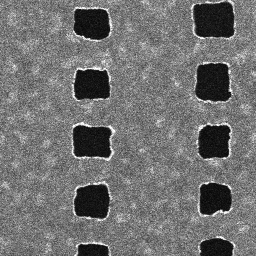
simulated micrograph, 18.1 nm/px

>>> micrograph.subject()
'a regular array of holes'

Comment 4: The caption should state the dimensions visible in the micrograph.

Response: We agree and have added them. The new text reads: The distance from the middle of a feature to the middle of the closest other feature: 1050 nanometers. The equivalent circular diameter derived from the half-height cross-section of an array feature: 0.652 um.